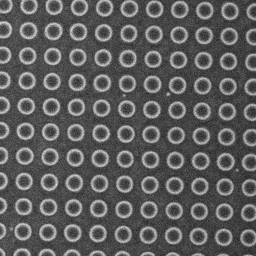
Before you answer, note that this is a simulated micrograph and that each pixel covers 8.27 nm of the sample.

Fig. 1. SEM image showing an array of small figures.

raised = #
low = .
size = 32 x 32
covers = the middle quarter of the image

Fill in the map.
...............##....##....###..
................................
................................
..###...###...###....###....#...
.####...####..####..####..####..
.####...####..####..####..####..
...#....###....##....###...###..
................................
................................
..###...###....##....##.........
.####..####...####..####..####..
.####..####...####..####..####..
..##....###...###...####..####..
...........................##...
................................
..##....##......................
.####..####...###...###....###..
.####..####...####..####..####..
.###....###...###...####..####..
...............#.....##....##...
................................
..#.............................
.####..####...###...###....##...
.####..####..####...####..####..
.###...####..####...####..####..
........##....##....###...###...
................................
................................
.###...###....###...###....#....
.####..####..####...###...####..
.###...####..####..####...####..
.###...###....###...###...###...